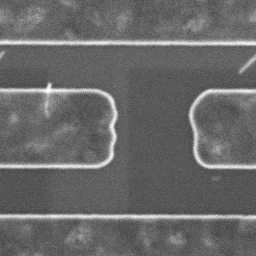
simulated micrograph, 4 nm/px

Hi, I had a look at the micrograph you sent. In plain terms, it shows one or a few lines or trenches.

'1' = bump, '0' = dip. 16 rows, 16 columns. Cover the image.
1111111111111111
1111111111111111
1111111111111111
0000000000000000
0000000000000000
0000000000000000
1111111000001111
1111111000001111
1111111000001111
1111111000001111
0000000000000000
0000000000000000
0000000000000000
0000111000110110
1111111111111111
1111111111111111